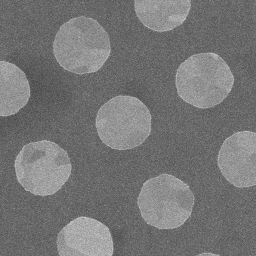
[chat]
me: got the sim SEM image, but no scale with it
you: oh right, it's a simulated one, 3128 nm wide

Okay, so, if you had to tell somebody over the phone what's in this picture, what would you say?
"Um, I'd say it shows raised bodies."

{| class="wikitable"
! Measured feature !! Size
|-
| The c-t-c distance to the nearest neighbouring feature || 1.1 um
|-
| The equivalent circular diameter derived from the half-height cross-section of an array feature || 668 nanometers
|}